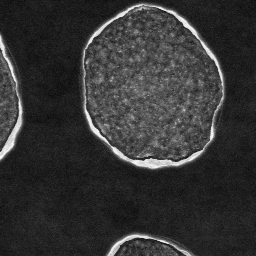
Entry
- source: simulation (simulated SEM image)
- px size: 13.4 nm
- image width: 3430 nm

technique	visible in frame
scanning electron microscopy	holes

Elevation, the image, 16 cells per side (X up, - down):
XXXXXXXX--XXXXXX
XXXXXXX----XXXXX
XXXXXX------XXXX
XXXXX--------XXX
-XXXX---------XX
-XXXX---------XX
-XXXX---------XX
-XXXXX-------XXX
-XXXXX-------XXX
XXXXXXX-----XXXX
XXXXXXXXXXXXXXXX
XXXXXXXXXXXXXXXX
XXXXXXXXXXXXXXXX
XXXXXXXXXXXXXXXX
XXXXXXXXXXXXXXXX
XXXXXXX----XXXXX